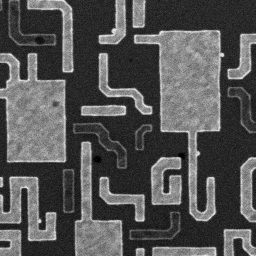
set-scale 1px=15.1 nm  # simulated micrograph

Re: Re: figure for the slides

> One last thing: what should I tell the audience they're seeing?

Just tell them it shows wiring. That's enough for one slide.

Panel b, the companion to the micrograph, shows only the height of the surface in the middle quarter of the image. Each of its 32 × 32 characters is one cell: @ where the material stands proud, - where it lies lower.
@@-------@@-------------@@@@@@@@
@@-------@@-------------@@@@@@@@
---------@@-------------@@@@@@@@
---------@@-------------@@@@@@@@
---------@@-------------@@@@@@@@
---------@@-------------@@@@@@@@
---------@@@@@@@@@------@@@@@@@@
----------@@@@@@@@@-----@@@@@@@@
-----------------@@@----@@@@@@@@
------------------@@----@@@@@@@@
-----------@@-----@@@---@@@@@@@@
-----@@@@@@@@@@----@@@--@@@@@@@@
-----@@@@@@@@@@---------@@@@@@@@
------------------------@@@@@@@@
------------------------@@@@@@@@
--@@@@@@@@----------@@--@@@@@@@@
--@@@@@@@@@-------@@@@--@@@@@@@@
--------@@@-------@@-----------@
---------@@-------@@-----------@
---------@@@@-----@@-----------@
-----@@---@@@@----@@-----------@
-----@@----@@@@----------------@
-----@@------@@----------------@
-----@@------@@---------@@@@@--@
-----@@------@@--------@@@@@@--@
-----@@------@@-------@@@@@@@--@
----@@@---------------@@@------@
@@--@@@---------------@@@------@
@@--@@@--@@-----------@@@-@@@--@
@@---@@--@@-----------@@@-@@@--@
@@---@@--@@-----------@@@-@@@--@
@@---@@--@@-----------@@@-@@@--@